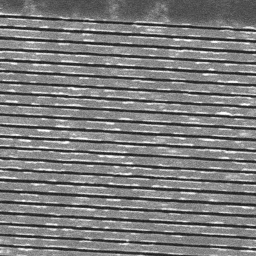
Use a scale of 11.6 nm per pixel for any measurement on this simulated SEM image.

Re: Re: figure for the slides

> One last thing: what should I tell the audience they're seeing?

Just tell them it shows parallel lines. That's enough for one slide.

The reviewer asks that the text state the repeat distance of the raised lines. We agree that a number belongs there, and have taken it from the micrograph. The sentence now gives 126 nm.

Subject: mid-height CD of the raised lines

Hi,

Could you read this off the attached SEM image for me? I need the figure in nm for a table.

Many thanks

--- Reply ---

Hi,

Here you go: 88.1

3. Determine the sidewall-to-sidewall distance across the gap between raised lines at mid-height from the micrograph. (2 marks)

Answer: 3.37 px